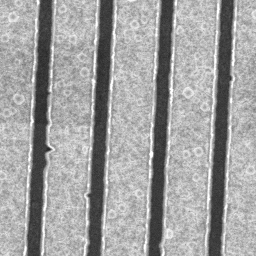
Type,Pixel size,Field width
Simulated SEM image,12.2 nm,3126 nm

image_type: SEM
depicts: parallel lines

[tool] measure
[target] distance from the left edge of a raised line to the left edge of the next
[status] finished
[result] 736 nm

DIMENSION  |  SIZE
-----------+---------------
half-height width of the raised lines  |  552 nm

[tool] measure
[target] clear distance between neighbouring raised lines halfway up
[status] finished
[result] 0.184 microns